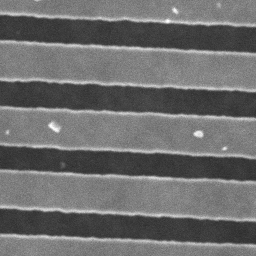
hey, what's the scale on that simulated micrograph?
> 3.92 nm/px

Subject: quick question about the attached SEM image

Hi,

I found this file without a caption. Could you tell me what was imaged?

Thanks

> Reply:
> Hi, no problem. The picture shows lines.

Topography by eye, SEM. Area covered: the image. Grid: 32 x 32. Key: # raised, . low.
################################
################################
.............##.################
................................
................................
########........................
###########################.....
################################
################################
################################
.........##.####################
................................
................................
######..........................
#########################.......
################################
################################
################################
.......#########################
...........................#####
................................
#####...........................
############################....
################################
################################
################################
........########################
.............................###
................................
######..........................
##############################..
################################